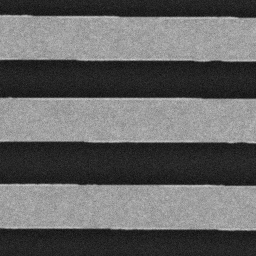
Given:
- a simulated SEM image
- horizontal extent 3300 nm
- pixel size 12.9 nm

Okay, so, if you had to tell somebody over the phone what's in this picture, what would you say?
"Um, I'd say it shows lines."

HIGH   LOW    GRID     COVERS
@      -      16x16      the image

----------------
@@@@@@@@@@@@@@@@
@@@@@@@@@@@@@@@@
@@@@@@@@@@@@@@@@
----------------
----------------
@@@@@@@@@@@@@@@@
@@@@@@@@@@@@@@@@
@@@@@@@@@@@@@@@@
----------------
----------------
----------------
@@@@@@@@@@@@@@@@
@@@@@@@@@@@@@@@@
----------------
----------------